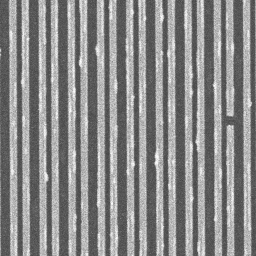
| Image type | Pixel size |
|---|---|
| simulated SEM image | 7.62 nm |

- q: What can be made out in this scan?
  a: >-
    parallel lines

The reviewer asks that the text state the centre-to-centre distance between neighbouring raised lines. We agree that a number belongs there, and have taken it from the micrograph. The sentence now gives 111 nm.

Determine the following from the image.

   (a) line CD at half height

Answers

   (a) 51.4 nm